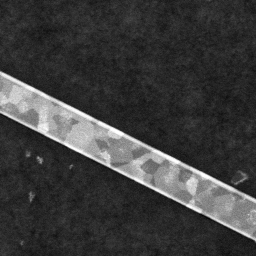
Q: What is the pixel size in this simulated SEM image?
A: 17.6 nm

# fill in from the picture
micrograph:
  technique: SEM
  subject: one or a few lines or trenches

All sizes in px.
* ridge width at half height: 34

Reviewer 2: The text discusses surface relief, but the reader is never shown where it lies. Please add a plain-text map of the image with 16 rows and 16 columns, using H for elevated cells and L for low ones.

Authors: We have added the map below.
LLLLLLLLLLLLLLLL
LLLLLLLLLLLLLLLL
LLLLLLLLLLLLLLLL
LLLLLLLLLLLLLLLL
LLLLLLLLLLLLLLLL
HHLLLLLLLLLLLLLL
HHHHLLLLLLLLLLLL
LHHHHHLLLLLLLLLL
LLLHHHHHLLLLLLLL
LLLLLHHHHHLLLLLL
LLLLLLLHHHHHLLLL
LLLLLLLLLHHHHHLL
LLLLLLLLLLLHHHHH
LLLLLLLLLLLLLHHH
LLLLLLLLLLLLLLLH
LLLLLLLLLLLLLLLL